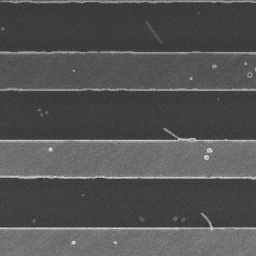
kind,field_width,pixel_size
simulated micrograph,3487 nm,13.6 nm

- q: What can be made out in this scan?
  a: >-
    lines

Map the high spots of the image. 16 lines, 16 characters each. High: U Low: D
DDDDDDDDDDDDDDDD
DDDDDDDDDDDDDDDD
DDDDDDDDDDDDDDDD
UUUUUUUUUUUUUUUU
UUUUUUUUUUUUUUUU
UUUUUUUUUUUUUUUU
DDDDDDDDDDDDDDDD
DDDDDDDDDDDDDDDD
DDDDDDDDDDDDDDDD
UUUUUUUUUUUUUUUU
UUUUUUUUUUUUUUUU
DDDDDDDDDDDDDDDD
DDDDDDDDDDDDDDDD
DDDDDDDDDDDDDDDD
UUUUUUUUUUUUUUUU
UUUUUUUUUUUUUUUU